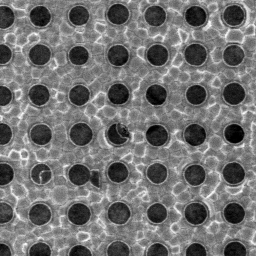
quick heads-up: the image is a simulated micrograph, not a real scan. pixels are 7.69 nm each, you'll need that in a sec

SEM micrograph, a regular array of raised bodies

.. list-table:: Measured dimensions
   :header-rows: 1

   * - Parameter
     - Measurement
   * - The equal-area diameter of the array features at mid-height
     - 175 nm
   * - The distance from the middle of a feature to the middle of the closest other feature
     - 293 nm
